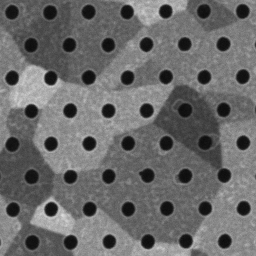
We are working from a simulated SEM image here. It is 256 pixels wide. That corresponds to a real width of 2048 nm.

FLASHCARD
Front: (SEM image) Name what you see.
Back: a regular array of holes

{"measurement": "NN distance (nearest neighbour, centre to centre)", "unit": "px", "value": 37.8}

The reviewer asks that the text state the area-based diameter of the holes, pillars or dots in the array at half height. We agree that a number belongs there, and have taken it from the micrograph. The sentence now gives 0.121 um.